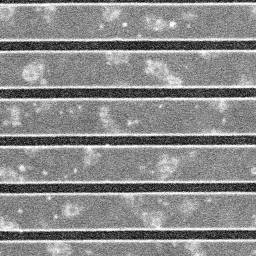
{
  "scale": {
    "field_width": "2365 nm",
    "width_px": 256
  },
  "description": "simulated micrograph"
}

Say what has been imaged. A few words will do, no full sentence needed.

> parallel lines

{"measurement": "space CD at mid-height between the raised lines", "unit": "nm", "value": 97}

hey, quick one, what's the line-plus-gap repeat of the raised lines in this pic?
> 437 nm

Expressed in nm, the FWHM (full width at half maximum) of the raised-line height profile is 342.